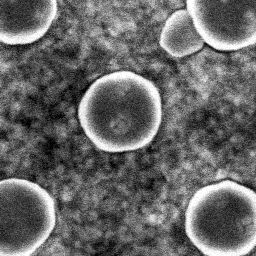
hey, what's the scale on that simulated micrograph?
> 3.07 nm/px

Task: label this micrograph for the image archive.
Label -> raised bodies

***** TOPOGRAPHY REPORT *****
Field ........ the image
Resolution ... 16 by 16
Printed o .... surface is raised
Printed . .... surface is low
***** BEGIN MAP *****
ooo.........oooo
ooo.........oooo
oo...........ooo
................
................
......oooo......
.....ooooo......
.....ooooo......
......ooo.......
................
................
oo..............
ooo.........oooo
ooo.........oooo
ooo.........oooo
oo...........ooo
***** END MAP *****